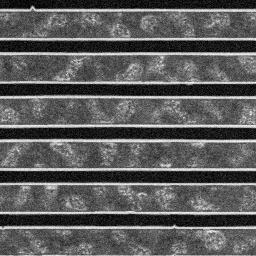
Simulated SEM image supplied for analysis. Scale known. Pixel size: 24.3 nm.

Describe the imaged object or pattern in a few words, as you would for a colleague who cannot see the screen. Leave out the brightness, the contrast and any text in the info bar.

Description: parallel lines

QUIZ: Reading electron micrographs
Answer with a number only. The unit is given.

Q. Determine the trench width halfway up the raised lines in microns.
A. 0.352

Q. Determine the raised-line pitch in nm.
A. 1060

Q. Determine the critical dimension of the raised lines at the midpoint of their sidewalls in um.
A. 0.707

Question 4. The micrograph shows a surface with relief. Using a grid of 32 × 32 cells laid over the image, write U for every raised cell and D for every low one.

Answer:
DDDDDDDDDDDDDDDDDDDDDDDDDDDDDDDD
UUUUUUUUUUUUUUUUUUUUUUUUUUUUUUUU
UUUUUUUUUUUUUUUUUUUUUUUUUUUUUUUU
UUUUUUUUUUUUUUUUUUUUUUUUUUUUUUUU
UUUUUUUUUUUUUUUUUUUUUUUUUUUUUUUU
DDDDDDDDDDDDDDDDDDDDDDDDDDDDDDDD
DDDDDDDDDDDDDDDDDDDDDDDDDDDDDDDD
UUUUUUUUUUUUUUUUUUUUUUUUUUUUUUUU
UUUUUUUUUUUUUUUUUUUUUUUUUUUUUUUU
UUUUUUUUUUUUUUUUUUUUUUUUUUUUUUUU
DDDDDDDDDDDDDDDDDDDDDDDDDDDDDDDD
DDDDDDDDDDDDDDDDDDDDDDDDDDDDDDDD
UUUUUUUUUUUUUUUUUUUUUUUUUUUUUUUU
UUUUUUUUUUUUUUUUUUUUUUUUUUUUUUUU
UUUUUUUUUUUUUUUUUUUUUUUUUUUUUUUU
UUUUUUUUUUUUUUUUUUUUUUUUUUUUUUUU
DDDDDDDDDDDDDDDDDDDDDDDDDDDDDDDD
DDDDDDDDDDDDDDDDDDDDDDDDDDDDDDDD
UUUUUUUUUUUUUUUUUUUUUUUUUUUUUUUU
UUUUUUUUUUUUUUUUUUUUUUUUUUUUUUUU
UUUUUUUUUUUUUUUUUUUUUUUUUUUUUUUU
DDDDDDDDDDDDDDDDDDDDDDDDDDDDDDDD
DDDDDDDDDDDDDDDDDDDDDDDDDDDDDDDD
UUUUUUUUUUUUUUUUUUUUUUUUUUUUUUUU
UUUUUUUUUUUUUUUUUUUUUUUUUUUUUUUU
UUUUUUUUUUUUUUUUUUUUUUUUUUUUUUUU
UUUUUUUUUUUUUUUUUUUUUUUUUUUUUUUU
DDDDDDDDDDDDDDDDDDDDDDDDDDDDDDDD
DDDDDDDDDDDDDDDDDDDDDUDDDDDDDDDD
UUUUUUUUUUUUUUUUUUUUUUUUUUUUUUUU
UUUUUUUUUUUUUUUUUUUUUUUUUUUUUUUU
UUUUUUUUUUUUUUUUUUUUUUUUUUUUUUUU